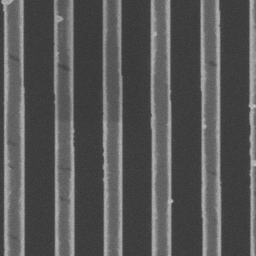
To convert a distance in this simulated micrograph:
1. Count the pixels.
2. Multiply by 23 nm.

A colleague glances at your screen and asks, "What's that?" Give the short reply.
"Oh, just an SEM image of lines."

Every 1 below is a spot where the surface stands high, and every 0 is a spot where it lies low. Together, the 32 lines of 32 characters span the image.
11100001100001100001100001100001
01100001100001100001100001100001
01100001100001100001100001100001
01100001100001100001100001100001
01100001100001100001100001100001
01100001100001100001100001100001
01100001100001100001100001100000
01100001100001100001100001100000
01100001100001100001100001100000
01100001100001100001100001100001
01100001100001100001100001100001
01100001100001100001100001100001
01100001100001100001100001100001
01100001100001100001100001100001
01100001100001100001100001100001
01100001100001100001100001100001
01100001100001100001100001100001
01100001100001100001100001100001
01100001100001100001100001100001
01100001100001100001100001100001
01100001100001100001100001100001
01100001100001100001100001100001
01100001100001100001100001100001
01100001100001100001100001100001
01100001100001100001100001100001
01100001100001100001100001100001
01100001100001100001100001100001
01100001100001100001100001100001
01100001100001100001100001100001
01100001100001100001100000100001
01100001100001100001100000100001
01100001100001100001100001100001